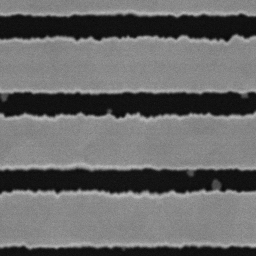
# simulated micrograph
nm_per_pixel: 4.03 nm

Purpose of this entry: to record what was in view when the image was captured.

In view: lines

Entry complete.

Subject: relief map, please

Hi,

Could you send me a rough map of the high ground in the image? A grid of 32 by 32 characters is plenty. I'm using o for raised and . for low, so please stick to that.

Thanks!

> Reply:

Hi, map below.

oooooooooooooooooooooooooooooooo
oooooooooooooooooooooooooooooooo
................................
................................
..................o..........o..
oooooooooooooooooooooooooooooooo
oooooooooooooooooooooooooooooooo
oooooooooooooooooooooooooooooooo
oooooooooooooooooooooooooooooooo
oooooooooooooooooooooooooooooooo
oooooooooooooooooooooooooooooooo
ooo.oooooooooooooo.ooo.oooooooo.
................................
................................
o.oooo.ooooooo..oo..oooooooooooo
oooooooooooooooooooooooooooooooo
oooooooooooooooooooooooooooooooo
oooooooooooooooooooooooooooooooo
oooooooooooooooooooooooooooooooo
oooooooooooooooooooooooooooooooo
oooooooooooooooooooooooooooooooo
................................
................................
................................
oooooooooooooooooooooooooooooooo
oooooooooooooooooooooooooooooooo
oooooooooooooooooooooooooooooooo
oooooooooooooooooooooooooooooooo
oooooooooooooooooooooooooooooooo
oooooooooooooooooooooooooooooooo
oooooooooooooooooooooooooooooooo
................................